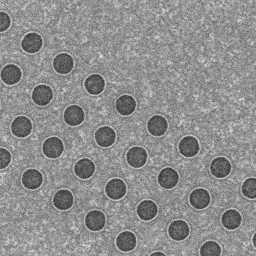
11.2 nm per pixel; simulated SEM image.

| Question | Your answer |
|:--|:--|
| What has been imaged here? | a regular array of holes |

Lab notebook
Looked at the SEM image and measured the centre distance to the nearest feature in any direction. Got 420 nm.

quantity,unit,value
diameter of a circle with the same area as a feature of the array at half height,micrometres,0.241